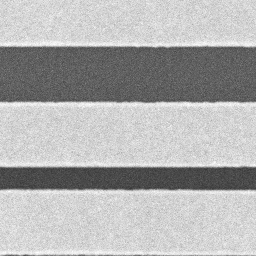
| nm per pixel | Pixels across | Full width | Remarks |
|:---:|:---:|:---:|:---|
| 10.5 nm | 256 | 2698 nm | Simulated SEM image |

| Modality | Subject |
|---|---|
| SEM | lines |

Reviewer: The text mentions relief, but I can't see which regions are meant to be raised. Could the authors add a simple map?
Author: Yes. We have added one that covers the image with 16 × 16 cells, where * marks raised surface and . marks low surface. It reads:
****************
****************
****************
................
................
................
****************
****************
****************
****************
................
................
****************
****************
****************
****************